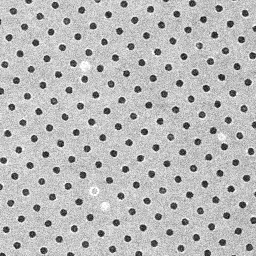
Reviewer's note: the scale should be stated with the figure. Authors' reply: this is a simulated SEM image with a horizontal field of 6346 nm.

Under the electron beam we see a regular array of holes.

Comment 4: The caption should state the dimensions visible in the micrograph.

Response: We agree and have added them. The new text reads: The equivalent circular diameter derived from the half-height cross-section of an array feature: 194 nm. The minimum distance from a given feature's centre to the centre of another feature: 464 nanometres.